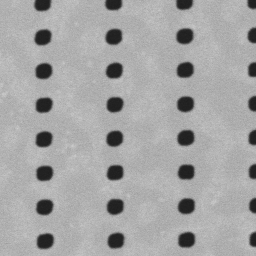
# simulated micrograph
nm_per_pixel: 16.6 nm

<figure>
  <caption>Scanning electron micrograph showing a regular array of holes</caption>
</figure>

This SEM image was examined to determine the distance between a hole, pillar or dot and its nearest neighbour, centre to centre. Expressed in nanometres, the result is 559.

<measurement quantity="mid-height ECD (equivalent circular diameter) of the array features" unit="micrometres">0.282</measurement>